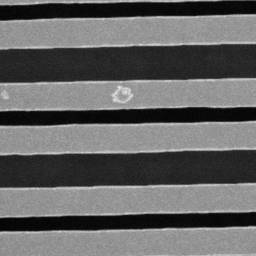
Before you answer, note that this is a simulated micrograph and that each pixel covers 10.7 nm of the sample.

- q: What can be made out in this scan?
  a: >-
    lines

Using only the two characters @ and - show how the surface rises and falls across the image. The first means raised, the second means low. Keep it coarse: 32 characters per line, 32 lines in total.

@@@@@---------------------------
--------------------------------
----@@@@@@@@@@@@@@@@@@@@@@@@@@@@
@@@@@@@@@@@@@@@@@@@@@@@@@@@@@@@@
@@@@@@@@@@@@@@@@@@@@@@@@@@@@@@@@
@@@@@@@@@@@@@@@@@@@@@@@@@@@-----
--------------------------------
--------------------------------
--------------------------------
--------------------------------
@@@@@@@@@@@@@@@@@@@@@@@@@@@@@@@@
@@@@@@@@@@@@@@@@@@@@@@@@@@@@@@@@
@@@@@@@@@@@@@@@@@@@@@@@@@@@@@@@@
@@@@@@@@@@@@@@@@@@@@------------
--------------------------------
-----------------@@@@@@@@@@@@@@@
@@@@@@@@@@@@@@@@@@@@@@@@@@@@@@@@
@@@@@@@@@@@@@@@@@@@@@@@@@@@@@@@@
@@@@@@@@@@@@@@@@@@@@@@@@@@@@@@@@
--------------------------------
--------------------------------
--------------------------------
--------------------------------
-------@@@@@@@@@@@@@@@@@@@@@@@@@
@@@@@@@@@@@@@@@@@@@@@@@@@@@@@@@@
@@@@@@@@@@@@@@@@@@@@@@@@@@@@@@@@
@@@@@@@@@@@@@@@@@@@@@@@@@@@@@@@-
--------------------------------
----------------------------@@@@
@@@@@@@@@@@@@@@@@@@@@@@@@@@@@@@@
@@@@@@@@@@@@@@@@@@@@@@@@@@@@@@@@
@@@@@@@@@@@@@@@@@@@@@@@@@@@@@@@@